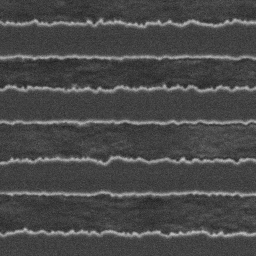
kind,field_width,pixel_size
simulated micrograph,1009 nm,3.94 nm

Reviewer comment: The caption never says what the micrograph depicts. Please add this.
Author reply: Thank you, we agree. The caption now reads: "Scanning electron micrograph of lines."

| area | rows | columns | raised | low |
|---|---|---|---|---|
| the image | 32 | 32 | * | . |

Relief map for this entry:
................................
................................
.............................*..
********************************
********************************
********************************
********************************
................................
................................
................................
................................
********************************
********************************
********************************
********************************
.................*..*...........
................................
................................
................................
................................
********************************
********************************
********************************
********************************
..............*...............*.
................................
................................
................................
................................
********************************
********************************
********************************